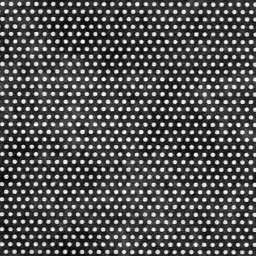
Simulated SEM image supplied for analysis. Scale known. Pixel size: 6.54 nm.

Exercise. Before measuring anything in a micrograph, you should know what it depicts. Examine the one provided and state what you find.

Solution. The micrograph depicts a regular array of raised bodies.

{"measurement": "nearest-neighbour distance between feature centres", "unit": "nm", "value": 53.7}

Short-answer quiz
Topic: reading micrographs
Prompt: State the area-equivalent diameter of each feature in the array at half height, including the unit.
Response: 24.5 nm